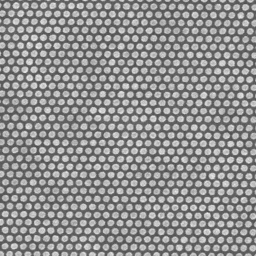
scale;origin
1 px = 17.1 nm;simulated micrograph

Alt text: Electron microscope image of a regular array of raised bodies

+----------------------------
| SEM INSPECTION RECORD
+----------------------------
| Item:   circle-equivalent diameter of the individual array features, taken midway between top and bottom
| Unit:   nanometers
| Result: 108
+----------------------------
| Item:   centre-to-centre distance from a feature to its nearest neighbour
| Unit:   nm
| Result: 152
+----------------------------